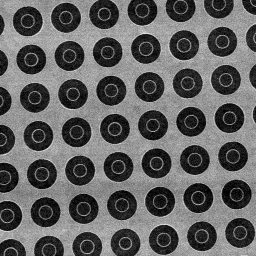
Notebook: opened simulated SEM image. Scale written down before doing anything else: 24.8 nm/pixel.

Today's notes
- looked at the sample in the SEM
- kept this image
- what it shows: an array of small figures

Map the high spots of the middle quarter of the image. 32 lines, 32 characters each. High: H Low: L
LLLLHHHHHLLLLHHHHHHHHHHHHHHHHHHH
LLLHHHHHHHHHHHHHHHHHHHHHHHHHHLLL
HHHHHHHHHHHHHHHHHHHLLLLHHHHHLLLL
HHHHHHHHHHLLLLHHHHLLLLLLHHHLLLHH
LLLLLHHHHLLLLLLHHHLLHHLLLHHLLHHH
LLLLLLHHLLLHHLLHHHLLHHHLLHHLLHHH
LHHLLLHHLLHHHLLLHHLLHHHLLHHLLLLL
LHHHLLHHLLLHHLLLHHLLLLLLLHHHLLLL
LHHLLLHHLLLLLLLHHHHLLLLLHHHHHHLL
LLLLLLHHHLLLLLHHHHHHHLHHHHHHHHHH
LLLLLHHHHHHLHHHHHHHHHHHHHHHHHHHH
HHHHHHHHHHHHHHHHHHHHHHLHHHHHHLLL
HHHHHHHHHHHHLLHHHHHHLLLLLHHHHLLL
HHLLLHHHHHLLLLLHHHHLLLLLLLHHLLLH
LLLLLLHHHLLLLLLLHHLLLHHHLLHHLLHH
LLLHLLLHHLLHHHLLLHLLLHHHLLHHLLLH
LLHHHLLHHLLHHHLLLHHLLHHLLLHHHLLL
LLHHHLLHHLLLHHLLHHHLLLLLLLHHHLLL
LLHHLLLHHHLLLLLLHHHHLLLLHHHHHHHH
LLLLLLHHHHHLLLLHHHHHHHHHHHHHHHHH
HLLLLHHHHHHHHHHHHHHHHHHHHHHHHHHL
HHHHHHHHHHHHHHHHHHHHHLLLLHHHHHLL
HHHHHHHHHHHHLLLLHHHHLLLLLLHHHLLL
HHLLLLHHHHHLLLLLLHHHLLHHLLLHHLLH
HLLLLLLHHHLLLHHLLHHLLLHHHLLHHLLH
LLLHHLLLHHLLHHHLLHHLLLHHHLLHHLLL
LLLHHHLLHHLLHHHLLHHHLLLLLLLHHHLL
LLLHHLLLHHLLLLLLLHHHLLLLLLHHHHHL
HLLLLLLHHHHLLLLLHHHHHHLLHHHHHHHH
HHLLLLLHHHHHHLHHHHHHHHHHHHHHHHHH
HHHHHHHHHHHHHHHHHHHHHHHHHHHHHHHL
HHHHHHHHHHHHHHLHHHHHHHLLLLHHHHLL